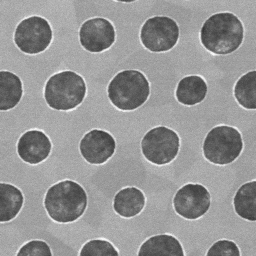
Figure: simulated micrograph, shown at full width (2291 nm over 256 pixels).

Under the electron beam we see a regular array of holes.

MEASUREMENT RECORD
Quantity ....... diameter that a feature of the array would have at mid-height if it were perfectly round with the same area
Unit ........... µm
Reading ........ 0.337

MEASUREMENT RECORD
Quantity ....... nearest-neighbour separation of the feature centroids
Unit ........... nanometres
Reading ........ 563